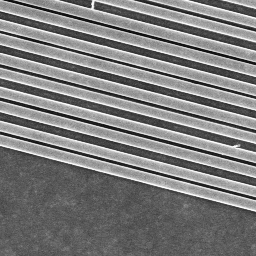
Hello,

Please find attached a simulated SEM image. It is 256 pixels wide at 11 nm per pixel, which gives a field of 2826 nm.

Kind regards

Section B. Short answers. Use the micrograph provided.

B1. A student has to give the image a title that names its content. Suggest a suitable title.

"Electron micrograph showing parallel lines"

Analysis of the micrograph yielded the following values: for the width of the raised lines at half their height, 114 nm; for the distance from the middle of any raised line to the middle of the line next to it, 179 nm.